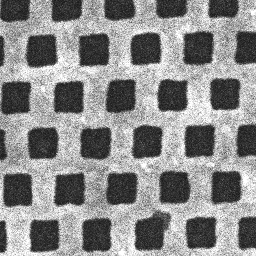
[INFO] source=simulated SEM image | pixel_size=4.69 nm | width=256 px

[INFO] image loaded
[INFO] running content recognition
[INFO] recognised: a regular array of holes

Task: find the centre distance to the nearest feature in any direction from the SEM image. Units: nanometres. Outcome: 244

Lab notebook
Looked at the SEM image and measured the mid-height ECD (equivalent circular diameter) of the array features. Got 0.161 um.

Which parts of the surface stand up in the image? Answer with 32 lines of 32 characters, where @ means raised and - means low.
----@@----@@@----@@----@@@----@@
----@@----@@@----@@@---@@@----@@
---@@@@--@@@@@-@@@@@@@@@@@@@@@@@
@@@@@@@@@@@@@@@@@@@@@@@@@@@@@@@@
@@@@---@@@---@@@@---@@@----@@@--
-@@----@@@----@@----@@@----@@---
-@@----@@@----@@----@@@----@@---
-@@----@@@----@@----@@@----@@---
@@@@@@@@@@@@@@@@@@@@@@@@@@@@@@@@
@@@@@@@@@@@@@@@@@@@@@@@@@@@@@@@@
----@@@---@@@@---@@@---@@@----@@
----@@@---@@@----@@@---@@@----@@
----@@@---@@@----@@@---@@@----@@
----@@@---@@@----@@@---@@@@---@@
@@@@@@@@@@@@@@@@@@@@@@@@@@@@@@@@
@@@@@@@@@@@@@@@@@@@@@@@@@@@@@@@-
-@@@---@@@----@@@---@@@----@@@--
-@@----@@@----@@@---@@@----@@@--
-@@@---@@@----@@@---@@@----@@@--
-@@@---@@@----@@@---@@@---@@@@-@
@@@@@@@@@@@@@@@@@@@@@@@@@@@@@@@@
@@@@@@@@@@@@@@@@@@@@---@@@@---@@
----@@@----@@----@@@----@@----@@
----@@@----@@----@@@----@@----@@
----@@@----@@----@@@----@@----@@
@---@@@---@@@@--@@@@@@-@@@@@@@@@
@@@@@@@@@@@@@@@@@@@@@@@@@@@@@@@@
@@@@@--@@@@---@@@---@@@@---@@@--
-@@@---@@@----@@@----@@----@@@--
-@@@----@@----@@@----@@----@@@--
-@@@---@@@----@@@---@@@----@@@--
@@@@--@@@@@@@@@@@@@@@@@@@@@@@@@@